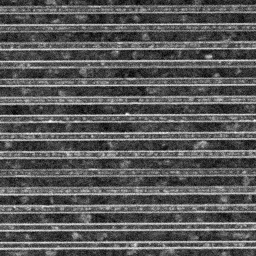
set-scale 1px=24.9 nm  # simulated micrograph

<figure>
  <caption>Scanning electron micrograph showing parallel lines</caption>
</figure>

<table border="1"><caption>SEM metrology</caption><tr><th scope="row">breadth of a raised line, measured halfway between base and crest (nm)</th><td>171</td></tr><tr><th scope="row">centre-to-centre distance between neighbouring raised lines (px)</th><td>18.1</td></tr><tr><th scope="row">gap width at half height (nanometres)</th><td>293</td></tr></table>